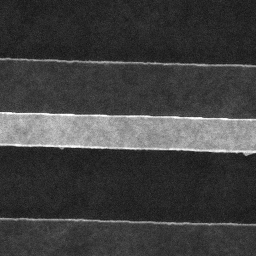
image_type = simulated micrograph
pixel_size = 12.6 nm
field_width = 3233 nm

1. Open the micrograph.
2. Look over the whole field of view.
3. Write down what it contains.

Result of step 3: lines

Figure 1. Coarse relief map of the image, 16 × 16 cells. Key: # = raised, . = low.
................
................
................
................
################
################
################
################
################
..............##
................
................
................
................
################
################